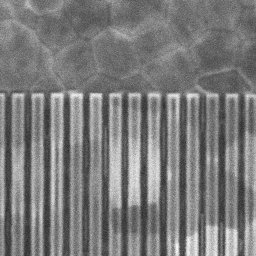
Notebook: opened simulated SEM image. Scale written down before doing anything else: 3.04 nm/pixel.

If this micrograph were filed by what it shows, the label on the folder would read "parallel lines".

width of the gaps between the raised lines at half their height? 25.4 nanometres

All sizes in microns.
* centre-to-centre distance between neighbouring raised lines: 0.0589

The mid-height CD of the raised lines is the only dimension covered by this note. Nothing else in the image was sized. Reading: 33.8 nanometers